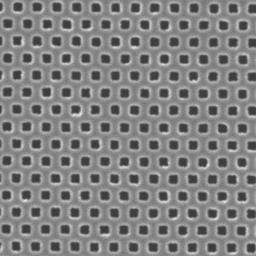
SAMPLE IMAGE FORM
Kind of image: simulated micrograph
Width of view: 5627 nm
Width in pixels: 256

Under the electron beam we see a regular array of holes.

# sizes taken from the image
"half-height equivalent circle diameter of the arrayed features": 0.226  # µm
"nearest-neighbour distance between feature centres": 422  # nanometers